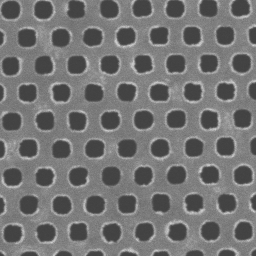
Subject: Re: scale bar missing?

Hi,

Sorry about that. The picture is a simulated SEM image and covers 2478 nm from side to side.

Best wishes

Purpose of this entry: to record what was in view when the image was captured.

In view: a regular array of holes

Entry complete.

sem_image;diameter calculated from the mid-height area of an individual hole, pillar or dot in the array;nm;188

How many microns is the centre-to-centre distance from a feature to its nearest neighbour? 0.308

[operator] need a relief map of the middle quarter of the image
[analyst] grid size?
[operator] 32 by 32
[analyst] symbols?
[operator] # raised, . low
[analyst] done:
#.....###.....####....####....##
#....####.....####....####....##
##..#######..###################
################################
################################
.#####...#####....####....####..
..###.....###.....####....####..
..###.....###.....####....####..
.####.....####....####....####..
######...######..###############
################################
################################
##...#####....####....####....##
#....####.....####....####.....#
#.....###.....###.....####.....#
#....#####....####....####....##
##...######.####################
################################
################################
.#####....####....####....####..
.####.....###.....####....####..
..###.....###.....###.....####..
.#####....####....####....####..
#######.#######..###############
################################
###########..###################
##....####....####....####....##
#.....####....###.....####.....#
#.....###.....###.....####....##
##....####....####....####....##
###.############################
################################